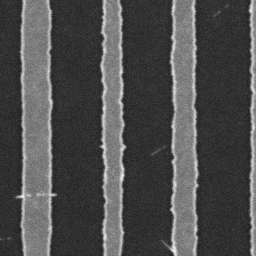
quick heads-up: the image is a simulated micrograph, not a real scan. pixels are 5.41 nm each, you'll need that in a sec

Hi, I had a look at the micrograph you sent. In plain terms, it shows one or a few lines or trenches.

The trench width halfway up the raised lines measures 289 nanometres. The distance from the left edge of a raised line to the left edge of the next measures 0.4 µm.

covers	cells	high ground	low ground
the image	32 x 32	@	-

---@@@-------@@-------@@-------@
---@@@-------@@-------@@-------@
---@@@-------@@-------@@-------@
---@@@-------@@-------@@-------@
---@@@-------@@-------@@-------@
---@@@-------@@-------@@-------@
---@@@-------@@-------@@-------@
---@@@-------@@------@@@--------
---@@@-------@@-------@@-------@
---@@@-------@@-------@@--------
---@@@-------@@-------@@-------@
---@@@-------@@-------@@--------
---@@@-------@@-------@@--------
---@@@-------@@-------@@-------@
---@@@-------@@-------@@-------@
---@@@-------@@-------@@-------@
---@@@-------@@-------@@-------@
---@@@-------@@-------@@-------@
---@@@-------@@-------@@--------
---@@@-------@@-------@@--------
---@@@-------@@-------@@@-------
---@@@-------@@-------@@@------@
---@@@-------@@-------@@@------@
---@@@-------@@-------@@-------@
---@@@-------@@-------@@-------@
---@@@-------@@-------@@-------@
---@@@-------@@-------@@-------@
---@@@-------@@-------@@@------@
---@@@-------@@-------@@@-------
---@@@-------@@-------@@@------@
---@@@-------@@-------@@@------@
---@@@-------@@-------@@-------@